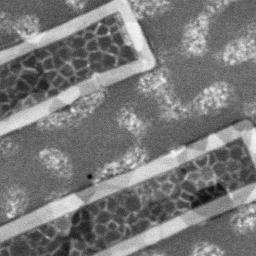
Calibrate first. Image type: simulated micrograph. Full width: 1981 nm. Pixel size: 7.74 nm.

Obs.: one or a few lines or trenches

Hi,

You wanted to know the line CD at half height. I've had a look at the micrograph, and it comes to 0.476 µm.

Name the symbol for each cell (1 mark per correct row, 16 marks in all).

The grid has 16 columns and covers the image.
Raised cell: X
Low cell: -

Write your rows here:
-------X--------
-----XXX--------
---XXXXXX-------
XXXXXXXXX-------
XXXXXXXX--------
XXXXX-----------
XXX-------------
X---------------
--------------XX
------------XXXX
----------XXXXXX
-------XXXXXXXXX
-----XXXXXXXXXX-
---XXXXXXXXX----
XXXXXXXXXX------
XXXXXXXX--------